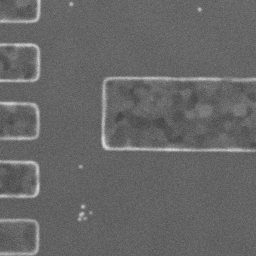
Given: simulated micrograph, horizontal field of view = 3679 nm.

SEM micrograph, wiring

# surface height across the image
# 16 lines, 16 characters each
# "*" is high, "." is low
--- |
**..............
................
................
**..............
**..............
.......*********
*......*********
**....**********
**....**********
................
**..............
**..............
................
................
**..............
**..............